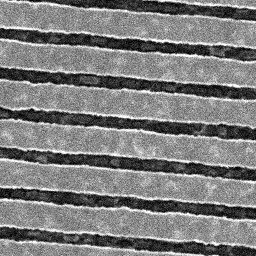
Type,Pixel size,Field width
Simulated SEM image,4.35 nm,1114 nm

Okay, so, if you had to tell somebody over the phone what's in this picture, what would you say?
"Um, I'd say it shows parallel lines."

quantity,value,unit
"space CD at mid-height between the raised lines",55.2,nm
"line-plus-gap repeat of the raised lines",172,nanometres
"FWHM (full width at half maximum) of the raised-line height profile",114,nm